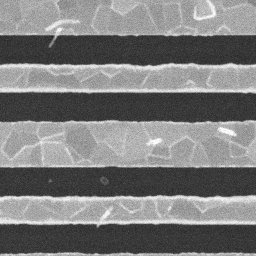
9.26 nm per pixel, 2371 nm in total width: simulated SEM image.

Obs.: lines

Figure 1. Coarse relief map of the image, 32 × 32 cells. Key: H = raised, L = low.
HHHHHHHHHHHHHHHHHHHHHHHHHHHHHHHH
HHHHHHHHHHHHHHHHHHHHHHHHHHHHHHHH
HHHHHHHHHHHHHHHHHHHHHHHHHHHHHHHH
HHHHHHHHHHHHHHHHHHHHHHHHHHHHHHHH
LLLLLLLLLLLLLLLLLLLLLLLLLLLLLLLL
LLLLLLLLLLLLLLLLLLLLLLLLLLLLLLLL
LLLLLLLLLLLLLLLLLLLLLLLLLLLLLLLL
LLLLLLLLLLLLLLLLLLLLLLLLLLLLLLLL
HHHHHHHHHHHHHHHHHHHHHHHHHHHHHHHH
HHHHHHHHHHHHHHHHHHHHHHHHHHHHHHHH
HHHHHHHHHHHHHHHHHHHHHHHHHHHHHHHH
LLLLLLLLLLLLLLLLLLLLLLLLLLLLLLLL
LLLLLLLLLLLLLLLLLLLLLLLLLLLLLLLL
LLLLLLLLLLLLLLLLLLLLLLLLLLLLLLLL
LLLLLLLLLLLLLLLLLLLLLLLLLLLLLLLL
HHHHHHHHHHHHHHHHHHHHHHHHHHHHHHHH
HHHHHHHHHHHHHHHHHHHHHHHHHHHHHHHH
HHHHHHHHHHHHHHHHHHHHHHHHHHHHHHHH
HHHHHHHHHHHHHHHHHHHHHHHHHHHHHHHH
HHHHHHHHHHHHHHHHHHHHHHHHHHHHHHHH
HHHHHHHHHHHHHHHHHHHHHHHHHHHHHHHH
LLLLLLLLLLLLLLLLLLLLLLLLLLLLLLLL
LLLLLLLLLLLLLLLLLLLLLLLLLLLLLLLL
LLLLLLLLLLLLLLLLLLLLLLLLLLLLLLLL
LLLLLLLLLLLLLLLLLLLLHLHLLLLLLLLH
HHHHHHHHHHHHHHHHHHHHHHHHHHHHHHHH
HHHHHHHHHHHHHHHHHHHHHHHHHHHHHHHH
HHHHHHHHHHHHHHHHHHHHHHHHHHHHHHHH
LLLLLLLLLLLLLLLLLLLLLLLLLLLLLLLL
LLLLLLLLLLLLLLLLLLLLLLLLLLLLLLLL
LLLLLLLLLLLLLLLLLLLLLLLLLLLLLLLL
LLLLLLLLLLLLLLLLLLLLLLLLLLLLLLLL